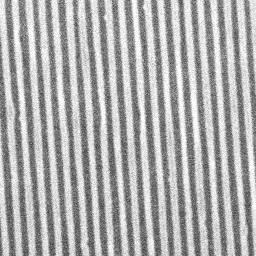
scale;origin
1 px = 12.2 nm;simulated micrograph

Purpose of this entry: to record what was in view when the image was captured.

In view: parallel lines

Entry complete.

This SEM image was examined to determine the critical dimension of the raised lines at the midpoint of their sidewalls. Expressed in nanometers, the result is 67.1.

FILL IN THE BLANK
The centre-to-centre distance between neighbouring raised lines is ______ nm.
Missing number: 162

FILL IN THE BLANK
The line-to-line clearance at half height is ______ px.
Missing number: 7.36